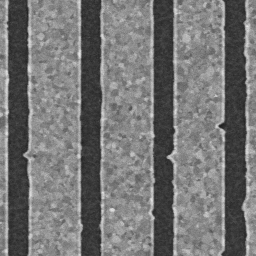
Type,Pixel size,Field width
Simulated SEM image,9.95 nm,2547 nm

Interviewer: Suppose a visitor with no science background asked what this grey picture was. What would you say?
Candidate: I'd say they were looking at one or a few lines or trenches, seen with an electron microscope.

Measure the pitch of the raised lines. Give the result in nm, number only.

719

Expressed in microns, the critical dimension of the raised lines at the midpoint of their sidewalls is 0.49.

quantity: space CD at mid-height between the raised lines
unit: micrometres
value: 0.235